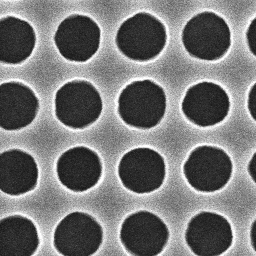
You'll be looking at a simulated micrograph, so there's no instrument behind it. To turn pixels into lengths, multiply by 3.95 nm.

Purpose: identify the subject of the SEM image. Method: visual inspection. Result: a regular array of holes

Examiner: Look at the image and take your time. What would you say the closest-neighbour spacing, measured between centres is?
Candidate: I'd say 252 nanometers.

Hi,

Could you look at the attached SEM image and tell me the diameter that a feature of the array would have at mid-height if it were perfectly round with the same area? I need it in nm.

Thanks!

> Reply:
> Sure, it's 185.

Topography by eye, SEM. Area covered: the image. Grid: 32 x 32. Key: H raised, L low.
HHHHHHHHHHHHHHHHHHHHHHHHHHHHHHHH
HHHHHHHHHHHHHHHHHHHHHHHHHHHHHHHH
LLLHHHHHLLLLHHHHLLLLHHHHLLLLHHHH
LLLLHHHLLLLLHHHLLLLLLHHLLLLLLHHL
LLLLHHHLLLLLHHHLLLLLLHHLLLLLLHHL
LLLLHHHLLLLLHHHLLLLLLHHLLLLLLHHL
LLLLHHHHLLLLHHHLLLLLHHHLLLLLHHHL
LLLHHHHHHLLHHHHHHLHHHHHHHHLHHHHH
HHHHHHHHHHHHHHHHHHHHHHHHHHHHHHHH
HHHHHHHHHHHHHHHHHHHHHHHHHHHHHHHH
LLLHHHHHLLLHHHHHLLLHHHHHHLLHHHHH
LLLLHHHLLLLLHHHLLLLLHHHLLLLLHHHL
LLLLLHHLLLLLLHHLLLLLLHHLLLLLLHHL
LLLLLHHLLLLLLHHLLLLLLHHLLLLLLHHL
LLLLHHHLLLLLHHHLLLLLHHHLLLLLHHHL
LLLLHHHHLLLHHHHHLLLLHHHHLLLHHHHH
HHHHHHHHHHHHHHHHHHHHHHHHHHHHHHHH
HHHHHHHHHHHHHHHHHHHHHHHHHHHHHHHH
HHHHHHHHHLLHHHHHHHHHHHHHHLLHHHHH
LLLLHHHHLLLLHHHLLLLLHHHHLLLLLHHH
LLLLHHHLLLLLLHHLLLLLLHHLLLLLLHHL
LLLLLHHLLLLLLHHLLLLLLHHLLLLLLHHL
LLLLLHHHLLLLHHHLLLLLHHHLLLLLLHHH
LLLLHHHHHLLHHHHHLLLLHHHHLLLLHHHH
HHHHHHHHHHHHHHHHHHHHHHHHHHHHHHHH
HHHHHHHHHHHHHHHHHHHHHHHHHHHHHHHH
HHHHHHHHHLHHHHHHHLLHHHHHHLHHHHHH
LLLLHHHHLLLLHHHHLLLLHHHHLLLLHHHH
LLLLHHHLLLLLLHHLLLLLLHHLLLLLLHHL
LLLLLHHLLLLLLHHLLLLLLHHLLLLLLHHL
LLLLLHHLLLLLLHHLLLLLLHHLLLLLLHHH
LLLLHHHLLLLLHHHHLLLLHHHHLLLLHHHH